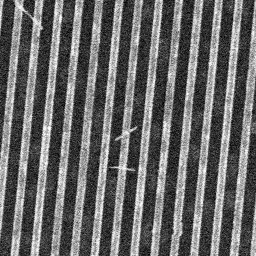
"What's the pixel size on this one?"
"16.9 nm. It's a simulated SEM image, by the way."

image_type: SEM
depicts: parallel lines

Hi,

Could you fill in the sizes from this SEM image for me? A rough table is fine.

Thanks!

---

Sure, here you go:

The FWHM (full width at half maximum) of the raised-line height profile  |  101 nm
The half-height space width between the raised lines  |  228 nm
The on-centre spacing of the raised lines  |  337 nm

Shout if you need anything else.